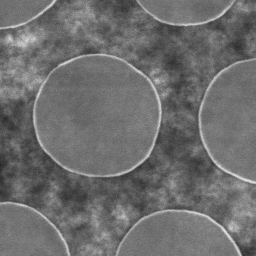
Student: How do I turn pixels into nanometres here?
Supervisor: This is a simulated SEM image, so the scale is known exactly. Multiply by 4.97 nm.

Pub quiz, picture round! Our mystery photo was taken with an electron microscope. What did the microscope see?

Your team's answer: raised bodies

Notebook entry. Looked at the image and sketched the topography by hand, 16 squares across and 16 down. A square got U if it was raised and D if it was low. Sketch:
UUUDDDDDDUUUUUDD
UDDDDDDDDDDUDDDD
DDDDDDDDDDDDDDDD
DDDDDUUDDDDDDDDD
DDDUUUUUUDDDDDUU
DDDUUUUUUUDDDUUU
DDUUUUUUUUDDDUUU
DDUUUUUUUUDDUUUU
DDUUUUUUUUDDDUUU
DDDUUUUUUDDDDUUU
DDDDUUUUDDDDDDUU
DDDDDDDDDDDDDDDD
DDDDDDDDDDDDDDDD
UUUDDDDDDUUUUDDD
UUUUDDDDUUUUUUDD
UUUUDDDUUUUUUUUD